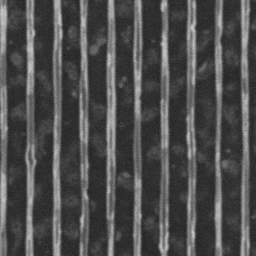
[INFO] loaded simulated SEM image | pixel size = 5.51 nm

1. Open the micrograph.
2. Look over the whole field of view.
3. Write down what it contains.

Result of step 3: parallel lines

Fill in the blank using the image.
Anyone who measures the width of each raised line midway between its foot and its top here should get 33.1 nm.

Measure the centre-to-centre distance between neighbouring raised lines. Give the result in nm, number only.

148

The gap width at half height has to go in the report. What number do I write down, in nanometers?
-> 113